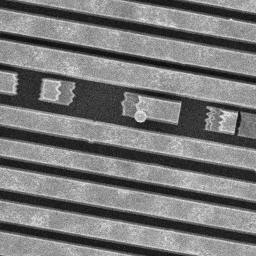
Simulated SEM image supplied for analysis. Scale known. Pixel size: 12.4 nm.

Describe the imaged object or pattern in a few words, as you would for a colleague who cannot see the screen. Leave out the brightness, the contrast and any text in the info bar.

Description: parallel lines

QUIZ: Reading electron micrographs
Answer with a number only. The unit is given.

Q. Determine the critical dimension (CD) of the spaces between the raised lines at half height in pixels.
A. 11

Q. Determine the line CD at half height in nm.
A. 252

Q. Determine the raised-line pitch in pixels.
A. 31.3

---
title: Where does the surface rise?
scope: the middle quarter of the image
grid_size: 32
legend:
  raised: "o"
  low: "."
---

ooooooooooooooooooooo...........
ooooooooooooooooooooooooooo.....
oooooooooooooooooooooooooooooooo
.....ooooooooooooooooooooooooooo
...........ooooooooooooooooooooo
................oooooooooooooooo
......................oooooooooo
............................oooo
...................ooo..........
...................oooooooo.....
..................ooooooooooo...
..................ooooooooooo...
..................ooooooooooo...
o.................ooooooooooo...
ooooooo............o......oo....
ooooooooooooo...................
oooooooooooooooooo..............
oooooooooooooooooooooooo........
...ooooooooooooooooooooooooooo..
........oooooooooooooooooooooooo
..............oooooooooooooooooo
o..................ooooooooooooo
oooooo...................ooooooo
oooooooooooo...................o
oooooooooooooooooo..............
ooooooooooooooooooooooo.........
....ooooooooooooooooooooooooo...
..........oooooooooooooooooooooo
...............ooooooooooooooooo
oooooo...............ooooooooooo
ooooooooooo................ooooo
ooooooooooooooooo...............